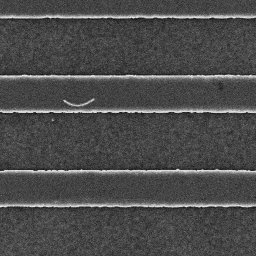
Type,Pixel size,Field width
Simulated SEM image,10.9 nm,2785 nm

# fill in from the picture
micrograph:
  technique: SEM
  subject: lines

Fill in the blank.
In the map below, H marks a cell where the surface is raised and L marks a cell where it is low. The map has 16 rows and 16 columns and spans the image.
HHHHHHHHHHHHHHHH
LLLLLLLLLLLLLLLL
LLLLLLLLLLLLLLLL
LLLLLLLLLLLLLLLL
LLLLLLLLLLLLLLLL
HHHHHHHHHHHHHHHH
HHHHHHHHHHHHHHHH
LLLLLLLLLLLLLLLL
LLLLLLLLLLLLLLLL
LLLLLLLLLLLLLLLL
LLLLLLLLLLLLLLLL
HHHHHHHHHHHHHHHH
HHHHHHHHHHHHHHHH
LLLLLLLLLLLLLLLL
LLLLLLLLLLLLLLLL
LLLLLLLLLLLLLLLL